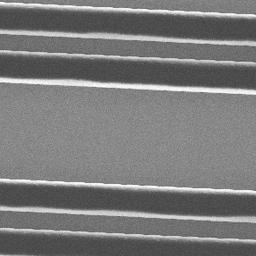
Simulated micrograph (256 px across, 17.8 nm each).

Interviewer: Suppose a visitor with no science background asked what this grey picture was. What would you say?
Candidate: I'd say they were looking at lines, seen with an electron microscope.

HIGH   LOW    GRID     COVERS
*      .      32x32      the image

**..............................
**********************..........
********************************
********************************
.............*******************
................................
***.............................
***********************.........
********************************
********************************
..........**********************
..............................**
................................
................................
................................
................................
................................
................................
................................
................................
................................
................................
................................
*********************...........
********************************
********************************
.........***********************
................................
................................
*******************.............
********************************
********************************